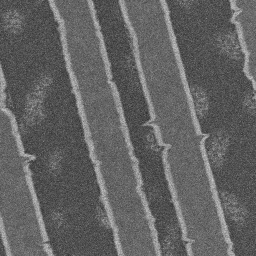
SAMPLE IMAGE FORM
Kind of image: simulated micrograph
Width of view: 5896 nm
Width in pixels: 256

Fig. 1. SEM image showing one or a few lines or trenches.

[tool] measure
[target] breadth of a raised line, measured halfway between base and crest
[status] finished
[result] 0.883 um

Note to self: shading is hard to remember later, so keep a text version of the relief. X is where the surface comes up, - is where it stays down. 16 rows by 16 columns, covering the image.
---XXX--XX-----X
----XX--XXX----X
----XX--XXX----X
----XXX--XX----X
----XXX--XX----X
-----XX--XXX----
-----XX--XXX----
X----XXX-XXX----
X----XXX--XXX---
XX----XX--XXX---
XX----XXX-XXX---
XX----XXX--XX---
XX-----XX--XXX--
XX-----XX--XXX--
XXX----XXX--XX--
XXX----XXX--XX--